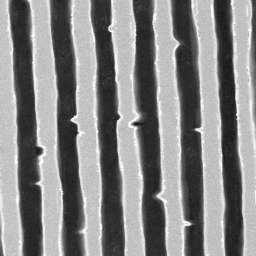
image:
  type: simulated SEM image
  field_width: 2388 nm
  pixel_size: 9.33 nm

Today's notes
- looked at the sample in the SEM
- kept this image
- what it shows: parallel lines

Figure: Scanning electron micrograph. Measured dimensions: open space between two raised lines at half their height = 169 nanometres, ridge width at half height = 205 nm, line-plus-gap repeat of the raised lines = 376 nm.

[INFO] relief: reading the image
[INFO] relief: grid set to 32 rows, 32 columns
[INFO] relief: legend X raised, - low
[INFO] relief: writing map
X---XX---XX---XXX--XXX--XXX--XX-
X---XX---XX---XXX--XXX--XXX--XX-
X---XX---XX---XXX--XXX--XXX--XX-
X---XX---XXX--XXX--XXX--XXX--XX-
X---XX---XXX--XXX--XXX--XXX--XX-
XX--XXX--XXX--XXX--XXX---XX--XX-
XX--XXX--XXX--XXX--XXX---XX--XX-
XX--XXX--XXX--XXX--XXX---XX--XX-
XX--XXX--XXX--XXX--XXX---XX--XX-
XX--XXX--XXX--XXX--XXX---XX--XXX
XX--XXX--XXX--XXX---XX---XXX-XXX
XX--XXX--XXX---XX---XX---XX--XXX
XX--XXX--XXX---XX---XXX--XXX-XXX
XX--XXX---XX---XX---XXX--XXX--XX
XX---XX--XXX---XXX--XXX--XXX--XX
XX---XX--XXX---XX---XXX--XXX--XX
XX---XX---XX---XX---XXX--XXX--XX
XX---XX--XXX---XXX--XXX--XXX--XX
XX---XX---XXX--XXX--XXX--XXX--XX
XX---XX---XXX--XXX--XXX--XXX--XX
XX---XX---XXX--XXX--XXX--XXX--XX
XX---XX---XXX--XXX--XXX--XXX--XX
XX---XXX--XXX--XXX--XXX--XXX--XX
XX---XXX--XXX--XXX--XXX--XXX--XX
XX---XXX--XXX--XXX--XXX--XXX--XX
XX---XXX--XXX--XXX--XXX--XXX--XX
XXX--XXX--XXX--XXX---XX--XXX--XX
XXX--XXX--XXX--XXX---XX--XXX--XX
XXX--XXX--XXX---XX---XX--XXX--XX
XXX--XXX--XXX---XX---XX--XXX--XX
XXX--XXX--XXX---XX---XX--XXX--XX
XXX--XXX--XXX---XX---XX--XXX--XX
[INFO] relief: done